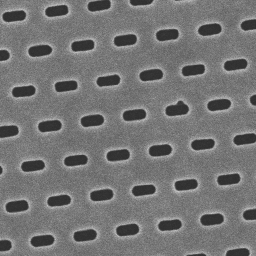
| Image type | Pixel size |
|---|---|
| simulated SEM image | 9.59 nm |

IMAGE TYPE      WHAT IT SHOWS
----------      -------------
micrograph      a regular array of holes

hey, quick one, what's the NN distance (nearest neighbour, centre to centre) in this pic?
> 0.409 µm